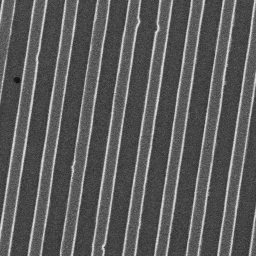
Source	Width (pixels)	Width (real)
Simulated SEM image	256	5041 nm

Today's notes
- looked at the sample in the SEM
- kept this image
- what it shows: parallel lines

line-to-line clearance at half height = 19.7 px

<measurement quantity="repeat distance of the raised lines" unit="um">0.614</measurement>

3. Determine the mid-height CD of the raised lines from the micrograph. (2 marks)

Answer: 234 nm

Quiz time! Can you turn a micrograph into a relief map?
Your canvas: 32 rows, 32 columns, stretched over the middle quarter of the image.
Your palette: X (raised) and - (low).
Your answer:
X-----XXX-----XXX-----XXX-----XX
X-----XXX-----XXX-----XXX----XXX
X-----XXX-----XX------XX-----XXX
X----XXXX----XXX-----XXX-----XXX
-----XXX-----XXX-----XXX-----XXX
-----XXX-----XXX-----XXX-----XXX
-----XXX-----XXX-----XXX-----XXX
-----XXX-----XXX-----XXX-----XX-
-----XXX----XXXX-----XXX----XXX-
-----XXX----XXX------XX-----XXX-
----XXXX----XXX-----XXX-----XXX-
----XXX-----XXX-----XXX-----XXX-
----XXX-----XXX-----XXX-----XXX-
----XXX-----XXX-----XXX-----XXX-
----XXX-----XXX-----XX------XX--
----XXX-----XXX-----XX-----XXX--
----XXX-----XX------XX-----XXX--
----XXX----XXX-----XXX-----XXX--
----XX-----XXX-----XXX-----XXX--
---XXX-----XXX-----XXX-----XXX--
---XXX-----XXX-----XXX-----XXX--
---XXX-----XXX-----XXX-----XXX--
---XXX-----XXX-----XX-----XXX---
---XXX-----XX-----XXX-----XXX---
---XXX----XXX-----XXX-----XXX---
--XXX-----XXX-----XXX-----XXX---
--XXX-----XXX-----XXX-----XXX---
--XXX-----XXX-----XXX-----XX----
--XXX-----XXX-----XX-----XXX----
--XXX-----XXX----XXX-----XXX----
--XXX-----XX-----XXX-----XXX----
--XXX----XXX-----XXX-----XXX----